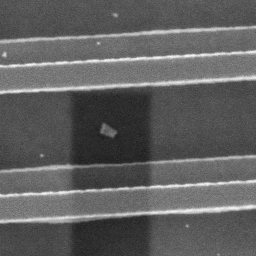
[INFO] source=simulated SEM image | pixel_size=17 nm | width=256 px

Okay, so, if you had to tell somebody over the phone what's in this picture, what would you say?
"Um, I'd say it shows lines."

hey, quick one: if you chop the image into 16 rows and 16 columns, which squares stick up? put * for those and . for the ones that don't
................
................
.***************
****************
****************
******..........
................
................
................
................
...*************
****************
****************
*******.........
................
................